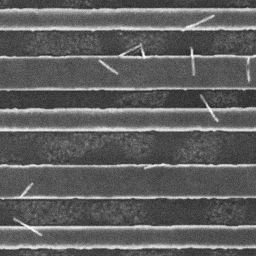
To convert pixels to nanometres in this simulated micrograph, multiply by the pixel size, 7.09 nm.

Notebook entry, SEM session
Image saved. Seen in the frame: lines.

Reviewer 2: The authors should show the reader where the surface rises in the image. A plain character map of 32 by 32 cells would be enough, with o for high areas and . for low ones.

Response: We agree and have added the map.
................................
oooooooooooooooooooooooooooooooo
oooooooooooooooooooooooooooooooo
oooooooooooooooooooooooooooooooo
................................
................................
................................
oooooooooooooooooooooooooooooooo
oooooooooooooooooooooooooooooooo
oooooooooooooooooooooooooooooooo
oooooooooooooooooooooooooooooooo
................................
................................
..........................o.....
oooooooooooooooooooooooooooooooo
oooooooooooooooooooooooooooooooo
................................
................................
................................
................................
....................o...........
oooooooooooooooooooooooooooooooo
oooooooooooooooooooooooooooooooo
oooooooooooooooooooooooooooooooo
oooooooooooooooooooooooooooooooo
................................
................................
................................
oooooooooooooooooooooooooooooooo
oooooooooooooooooooooooooooooooo
oooooooooooooooooooooooooooooooo
................................